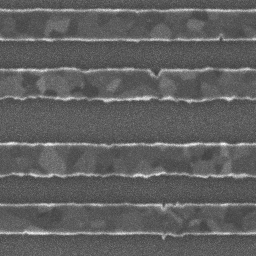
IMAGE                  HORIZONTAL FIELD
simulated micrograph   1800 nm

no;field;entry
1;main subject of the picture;one or a few lines or trenches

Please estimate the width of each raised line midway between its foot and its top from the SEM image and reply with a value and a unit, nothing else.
207 nm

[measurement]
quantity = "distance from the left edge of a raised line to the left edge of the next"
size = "0.455 µm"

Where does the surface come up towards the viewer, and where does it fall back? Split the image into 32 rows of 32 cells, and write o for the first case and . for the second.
................................
oooooooooooooooooooooooooooooooo
oooooooooooooooooooooooooooooooo
oooooooooooooooooooooooooooooooo
oooooooooooooooooooooooooooooooo
................................
................................
................................
................................
ooooooooooooooooooo.oooooooooooo
oooooooooooooooooooooooooooooooo
oooooooooooooooooooooooooooooooo
.............o........oooo......
................................
................................
................................
................................
................................
oooooooooooooooooooooooooooooooo
oooooooooooooooooooooooooooooooo
oooooooooooooooooooooooooooooooo
oooooooooooooooooooooooooooooooo
................................
................................
................................
................................
oooooooooooooooooooooooooooooooo
oooooooooooooooooooooooooooooooo
oooooooooooooooooooooooooooooooo
................................
................................
................................